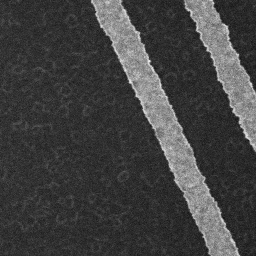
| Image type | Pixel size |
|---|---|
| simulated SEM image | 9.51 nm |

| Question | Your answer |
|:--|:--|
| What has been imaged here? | one or a few lines or trenches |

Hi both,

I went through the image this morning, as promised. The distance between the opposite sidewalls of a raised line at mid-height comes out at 240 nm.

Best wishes